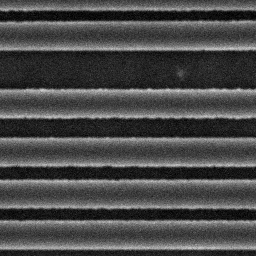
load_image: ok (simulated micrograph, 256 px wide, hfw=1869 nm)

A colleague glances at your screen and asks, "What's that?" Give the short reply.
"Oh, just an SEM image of lines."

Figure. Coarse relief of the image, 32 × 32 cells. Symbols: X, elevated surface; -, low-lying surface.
XXXXXXXXXXXXXXXXXXXXXXXXXXXXXXXX
--------------------------------
--------------------------------
XXXXXXXXXXXXXXXXXXXXXXXXXXXXXXXX
XXXXXXXXXXXXXXXXXXXXXXXXXXXXXXXX
XXXXXXXXXXXXXXXXXXXXXXXXXXXXXXXX
--------------------------------
--------------------------------
--------------------------------
--------------------------------
--------------------------------
XXXXXXXXXXXXXXXXXXXXXXXXXXXXXXXX
XXXXXXXXXXXXXXXXXXXXXXXXXXXXXXXX
XXXXXXXXXXXXXXXXXXXXXXXXXXXXXXXX
XXXXXXXXXXXXXXXXXXXXXXXXXXXXXXXX
--------------------------------
--------------------------------
XXXXXXXXXXXXXXXXXXXXXXXXXXXXXXXX
XXXXXXXXXXXXXXXXXXXXXXXXXXXXXXXX
XXXXXXXXXXXXXXXXXXXXXXXXXXXXXXXX
XXXXXXXXXXXXXXXXXXXXXXXXXXXXXXXX
--------------------------------
--------------------------------
XXXXXXXXXXXXXXXXXXXXXXXXXXXXXXXX
XXXXXXXXXXXXXXXXXXXXXXXXXXXXXXXX
XXXXXXXXXXXXXXXXXXXXXXXXXXXXXXXX
--------------------------------
--------------------------------
XXXXXXXXXXXXXXXXXXXXXXXXXXXXXXXX
XXXXXXXXXXXXXXXXXXXXXXXXXXXXXXXX
XXXXXXXXXXXXXXXXXXXXXXXXXXXXXXXX
--------------------------------